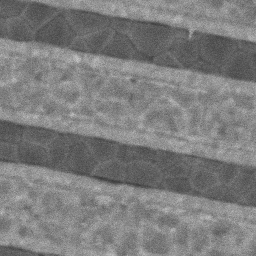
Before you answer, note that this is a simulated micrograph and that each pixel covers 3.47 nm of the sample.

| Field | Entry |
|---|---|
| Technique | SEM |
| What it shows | one or a few lines or trenches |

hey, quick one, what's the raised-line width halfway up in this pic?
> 246 nanometres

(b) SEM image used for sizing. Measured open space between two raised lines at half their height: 0.18 um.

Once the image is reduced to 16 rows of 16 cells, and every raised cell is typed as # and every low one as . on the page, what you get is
......##########
............####
................
####............
##########......
###############.
################
..##############
........########
.............###
................
######..........
###########.....
################
################
...#############